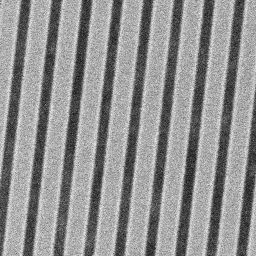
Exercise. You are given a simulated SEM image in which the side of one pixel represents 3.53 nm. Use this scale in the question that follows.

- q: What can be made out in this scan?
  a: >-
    parallel lines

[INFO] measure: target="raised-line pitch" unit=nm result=107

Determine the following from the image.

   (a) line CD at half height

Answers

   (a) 0.0693 microns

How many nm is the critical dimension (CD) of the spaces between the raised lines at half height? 39.5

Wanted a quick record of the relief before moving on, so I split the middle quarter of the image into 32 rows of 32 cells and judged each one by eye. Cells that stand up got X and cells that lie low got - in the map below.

XX---XXXXX---XXXXX---XXXX---XXXX
XX---XXXXX---XXXXX---XXXX---XXXX
XX---XXXXX---XXXXX---XXXX---XXXX
XX---XXXXX---XXXXX--XXXXX---XXXX
XX---XXXXX---XXXX---XXXXX---XXXX
XX---XXXXX---XXXX---XXXXX---XXXX
XX---XXXX---XXXXX---XXXXX---XXXX
XX---XXXX---XXXXX---XXXXX---XXXX
X---XXXXX---XXXXX---XXXX---XXXXX
X---XXXXX---XXXXX---XXXX---XXXXX
X---XXXXX---XXXXX--XXXXX---XXXXX
X---XXXXX---XXXXX--XXXXX---XXXXX
X---XXXXX---XXXX---XXXXX---XXXXX
X---XXXXX---XXXX---XXXXX---XXXXX
X---XXXXX--XXXXX---XXXXX---XXXXX
X---XXXX---XXXXX---XXXXX---XXXX-
X---XXXX---XXXXX---XXXXX---XXXX-
---XXXXX---XXXXX---XXXX---XXXXX-
---XXXXX---XXXXX---XXXX---XXXXX-
---XXXXX---XXXXX--XXXXX---XXXXX-
---XXXXX---XXXXX--XXXXX---XXXXX-
---XXXXX---XXXX---XXXXX---XXXXX-
---XXXXX---XXXX---XXXXX---XXXXX-
---XXXX---XXXXX---XXXXX---XXXXX-
---XXXX---XXXXX---XXXXX---XXXX--
--XXXXX---XXXXX---XXXXX---XXXX--
--XXXXX---XXXXX---XXXX---XXXXX--
--XXXXX---XXXXX---XXXX---XXXXX--
--XXXXX---XXXXX--XXXXX---XXXXX--
--XXXXX---XXXXX--XXXXX---XXXXX--
--XXXXX---XXXX---XXXXX---XXXX---
--XXXXX---XXXX---XXXXX---XXXX---